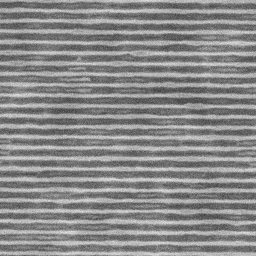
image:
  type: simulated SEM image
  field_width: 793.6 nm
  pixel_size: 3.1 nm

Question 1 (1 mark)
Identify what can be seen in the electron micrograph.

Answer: parallel lines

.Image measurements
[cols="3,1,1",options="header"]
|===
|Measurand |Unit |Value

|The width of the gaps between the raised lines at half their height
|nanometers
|21.7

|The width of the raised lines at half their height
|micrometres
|0.0108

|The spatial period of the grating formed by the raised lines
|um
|0.0327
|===